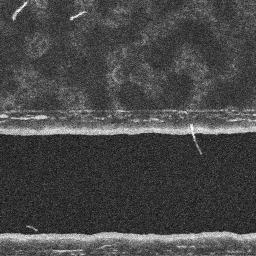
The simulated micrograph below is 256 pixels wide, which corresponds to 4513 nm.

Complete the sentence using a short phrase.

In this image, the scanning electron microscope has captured one or a few lines or trenches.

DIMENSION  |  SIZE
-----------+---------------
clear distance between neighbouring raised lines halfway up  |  1850 nm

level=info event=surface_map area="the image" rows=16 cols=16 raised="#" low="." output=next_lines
################
################
################
################
################
################
################
################
................
................
................
................
................
................
................
################